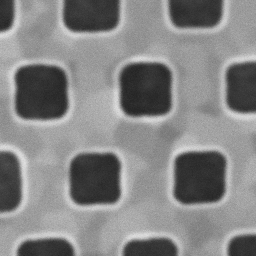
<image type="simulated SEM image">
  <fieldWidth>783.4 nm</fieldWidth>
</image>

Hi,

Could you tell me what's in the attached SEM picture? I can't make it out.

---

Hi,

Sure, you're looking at holes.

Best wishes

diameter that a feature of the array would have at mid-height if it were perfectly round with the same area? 0.183 um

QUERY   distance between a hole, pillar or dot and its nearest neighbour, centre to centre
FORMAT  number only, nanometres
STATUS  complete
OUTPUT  314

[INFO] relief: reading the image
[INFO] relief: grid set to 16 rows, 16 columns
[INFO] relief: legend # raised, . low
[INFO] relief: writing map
.###....##....##
.###...####...##
################
################
#...###....###..
#...###....###..
#...###....###..
##.#############
################
.####..####...##
.###....###...##
.###....###...##
.####..####...##
################
################
#....###...###..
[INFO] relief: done